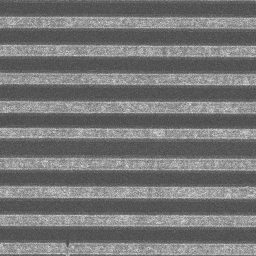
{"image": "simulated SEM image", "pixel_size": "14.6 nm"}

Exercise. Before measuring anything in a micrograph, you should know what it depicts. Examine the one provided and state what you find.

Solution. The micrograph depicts parallel lines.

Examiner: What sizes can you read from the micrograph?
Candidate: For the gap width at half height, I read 222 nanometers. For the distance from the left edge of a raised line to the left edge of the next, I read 414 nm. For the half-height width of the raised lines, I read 196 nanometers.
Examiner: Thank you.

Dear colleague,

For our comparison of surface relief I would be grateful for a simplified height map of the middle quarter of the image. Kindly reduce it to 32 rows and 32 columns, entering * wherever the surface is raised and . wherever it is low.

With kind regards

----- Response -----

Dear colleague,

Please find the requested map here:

................................
................................
********************************
********************************
********************************
................................
................................
................................
................................
********************************
********************************
********************************
.....**.........................
................................
................................
................................
********************************
********************************
********************************
................................
................................
................................
................................
************....................
********************************
********************************
********************************
................................
................................
................................
................................
********************************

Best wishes